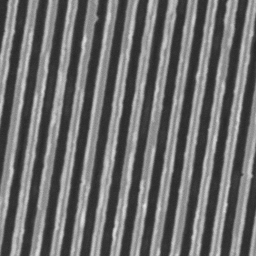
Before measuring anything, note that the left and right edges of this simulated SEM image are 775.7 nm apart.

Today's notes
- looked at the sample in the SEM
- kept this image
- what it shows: parallel lines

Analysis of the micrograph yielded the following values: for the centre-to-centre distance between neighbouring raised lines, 59.8 nm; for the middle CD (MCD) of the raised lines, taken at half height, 9.01 pixels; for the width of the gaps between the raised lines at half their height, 32.6 nm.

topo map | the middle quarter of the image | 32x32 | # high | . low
#...##...##...##...##...##...##.
#...##...##...##..###...##...##.
#...##...##..###..###...##...#..
#..##...##...##...##...###..##..
...##...##...##...##...##...##..
...##...##...##...##...##...##..
...##...##...##...##...##...##..
...##...##...##...##...##...##..
...##...##...##...##...##...##..
...##..###..###..###..###..###..
..##...##...###..##...###..##...
..##...##...##...##...##...##...
..##...##...##...##...##...##...
..##...##...##...##...##...##...
..##...##...##...##...##...##...
..##..###..###..###...##...##..#
..#...##...##...###..##...##...#
.###..##...##...##...##...##...#
.##...##...##...##...##...##...#
.##...##...##...##...##...##...#
.##...##...##...##...##...##...#
.##...##...##...##...##...##..##
.##..###..###..###..###..###..##
##...##...###..##...##...###..##
##...##...###..##...##...##...##
##...##...##...##...##...##...##
##...##...##...##...##...##...##
##...##...##...##...##...##...##
##..###...##...##...##..###..###
#...###..###..###..###..###..###
#...###..##...##...##...##...##.
#...##...##...##...##...##...##.